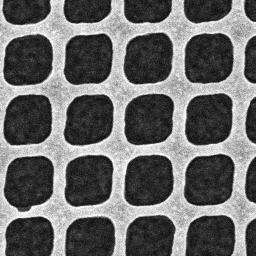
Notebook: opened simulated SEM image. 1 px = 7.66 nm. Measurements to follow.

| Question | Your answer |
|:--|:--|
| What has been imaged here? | a regular array of holes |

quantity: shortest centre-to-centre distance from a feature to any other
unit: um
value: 0.459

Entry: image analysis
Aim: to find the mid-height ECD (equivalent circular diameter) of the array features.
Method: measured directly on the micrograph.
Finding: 407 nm